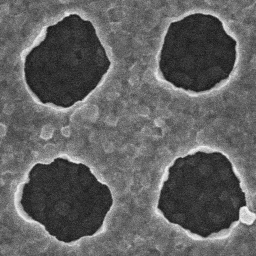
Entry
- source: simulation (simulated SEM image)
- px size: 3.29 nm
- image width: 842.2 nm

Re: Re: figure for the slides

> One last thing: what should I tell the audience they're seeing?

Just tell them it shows holes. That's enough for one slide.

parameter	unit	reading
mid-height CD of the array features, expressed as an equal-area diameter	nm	279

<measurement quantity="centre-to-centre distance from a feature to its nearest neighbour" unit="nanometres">439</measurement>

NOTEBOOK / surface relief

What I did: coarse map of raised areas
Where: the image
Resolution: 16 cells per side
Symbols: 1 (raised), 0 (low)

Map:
1111111111111111
1110001111100011
1110001111000001
1100000111000001
1100000111000011
1100001111100111
1110011111111111
1111111111111111
1111111111111111
1111111111110011
1100011111100001
1000001111000001
1000000111000001
1100000111000001
1110001111110011
1111111111111111